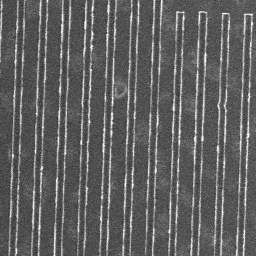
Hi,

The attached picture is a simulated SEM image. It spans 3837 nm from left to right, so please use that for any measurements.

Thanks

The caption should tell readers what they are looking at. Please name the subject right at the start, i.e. parallel lines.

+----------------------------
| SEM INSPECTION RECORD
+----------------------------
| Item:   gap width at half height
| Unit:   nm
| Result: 230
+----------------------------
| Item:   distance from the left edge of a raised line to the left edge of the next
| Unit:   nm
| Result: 341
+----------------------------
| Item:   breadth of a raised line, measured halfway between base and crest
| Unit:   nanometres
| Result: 116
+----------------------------